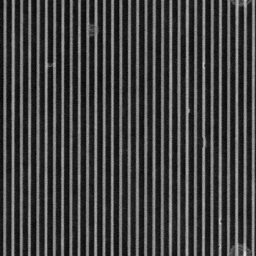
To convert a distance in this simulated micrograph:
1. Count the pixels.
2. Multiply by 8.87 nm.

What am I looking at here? parallel lines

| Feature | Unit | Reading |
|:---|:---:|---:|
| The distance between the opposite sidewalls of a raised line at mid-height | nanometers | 15.5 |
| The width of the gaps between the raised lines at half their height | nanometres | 54.3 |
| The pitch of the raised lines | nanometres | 73.5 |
